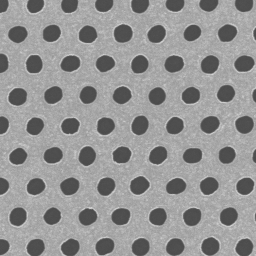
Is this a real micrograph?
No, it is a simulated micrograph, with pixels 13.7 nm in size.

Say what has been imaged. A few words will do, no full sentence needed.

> a regular array of holes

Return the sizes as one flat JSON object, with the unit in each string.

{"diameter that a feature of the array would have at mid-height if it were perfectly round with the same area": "0.241 micrometres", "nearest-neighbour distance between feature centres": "34 px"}